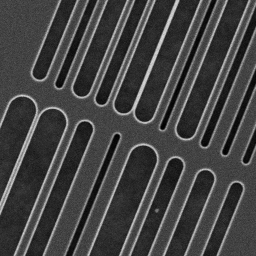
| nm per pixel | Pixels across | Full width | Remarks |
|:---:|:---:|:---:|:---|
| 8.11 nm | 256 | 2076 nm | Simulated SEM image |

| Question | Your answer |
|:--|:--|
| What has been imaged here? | groups of lines, slits or small figures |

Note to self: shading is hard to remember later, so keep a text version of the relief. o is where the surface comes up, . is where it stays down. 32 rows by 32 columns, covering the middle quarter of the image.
..oo.....oo...oo.....o......oo..
.ooo.....oo...oo.....o.....ooo.o
.oo.....oo....o............oo..o
.oo.....oo...oo.....o.....ooo.oo
ooo.....o....o......o.....oo..oo
oo.....oo...oo.....o......oo..oo
oo.....oo...oo.....o.....ooo.ooo
ooo...oo....o............oo..oo.
oooooooo...oo...........ooo.ooo.
oooooooo...oo...........oo..oo..
ooooooooooooo....o.....ooo..oo..
ooooooooooooo....o.....ooo.ooo..
oooooooooooooo..oo.....oo..oo...
.ooooooooooooooooo....ooo.ooo...
.ooo..ooooooooooooo..ooo..oo....
.oo....ooooooooooooooooo..oo....
ooo....ooooooooooooooooooooo....
oo.....ooooooooooooooooooooo....
oo.....ooooo..ooooooooooooooo...
oo....oooooo..oooooooooooooooooo
o.....ooooo..ooooo...ooooooooooo
o....oooooo..oooo......ooooooooo
.....oooooo.oooo.......ooooooooo
.....ooooo..oooo.......oooo.oooo
....oooooo..oooo.......ooo....oo
....ooooo..oooo........ooo....oo
....ooooo..oooo........oo.....oo
...oooooo.oooo........ooo....ooo
...ooooo..oooo........oo.....ooo
..oooooo..oooo.......ooo....oooo
..ooooo..oooo........oo.....oooo
..ooooo..oooo........oo.....oooo